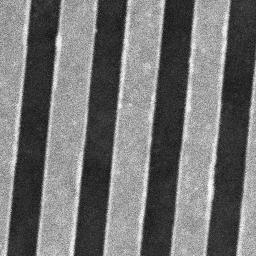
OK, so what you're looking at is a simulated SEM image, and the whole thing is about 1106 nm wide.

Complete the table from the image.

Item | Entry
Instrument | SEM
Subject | one or a few lines or trenches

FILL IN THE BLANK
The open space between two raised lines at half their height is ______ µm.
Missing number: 0.138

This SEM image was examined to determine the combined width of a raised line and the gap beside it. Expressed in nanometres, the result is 287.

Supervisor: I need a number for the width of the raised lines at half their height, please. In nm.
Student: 150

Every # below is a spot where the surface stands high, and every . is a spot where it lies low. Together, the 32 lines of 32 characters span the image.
####....####....####....#####...
####....####....####....####....
###.....####....####....####....
###....#####....####....####....
###....#####....####....####....
###....#####....####....####....
###....#####...#####....####....
###....####....#####....####....
###....####....#####....####....
###....####....#####....####....
###....####....####.....####....
###....####....####....#####....
###....####....####....#####....
###...#####....####....####....#
##....#####....####....####....#
##....#####....####....####....#
##....#####....####....####....#
##....#####...#####....####....#
##....####....#####....####....#
##....####....#####....####....#
##....####....#####....####....#
##....####....####....#####....#
##....####....####....#####....#
##...#####....####....#####....#
#....#####....####....#####...##
#....#####....####....####....##
#....#####....####....####....##
#....####.....####....####....##
#....####....#####....####....##
#....####....#####....####....##
#....####....#####....####....##
#....####....####.....####....##